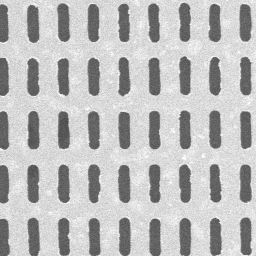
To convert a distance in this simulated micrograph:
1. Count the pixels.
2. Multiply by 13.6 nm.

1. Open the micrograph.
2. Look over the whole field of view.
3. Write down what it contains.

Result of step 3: a regular array of holes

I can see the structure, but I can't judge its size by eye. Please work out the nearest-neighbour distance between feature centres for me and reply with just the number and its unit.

0.408 micrometres